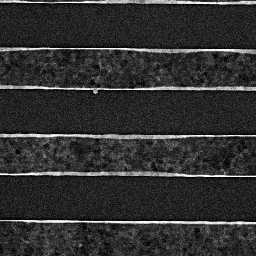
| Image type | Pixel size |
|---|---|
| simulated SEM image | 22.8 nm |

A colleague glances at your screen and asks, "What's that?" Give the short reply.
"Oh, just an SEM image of wiring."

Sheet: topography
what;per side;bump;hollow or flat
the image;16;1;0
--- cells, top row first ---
0000000000000000
0000000000000000
0000000000000000
1111111111111111
1111111111111111
0001111111011111
0000000000000000
0000000000000000
0000000000000000
1111111111111111
1111111111111111
0000000000000000
0000000000000000
0000000000000000
1111111111111111
1111111111111111